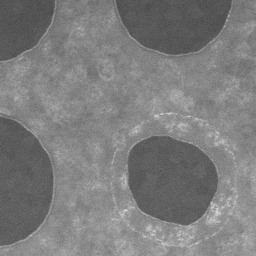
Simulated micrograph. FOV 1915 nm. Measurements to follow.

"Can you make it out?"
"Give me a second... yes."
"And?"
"raised bodies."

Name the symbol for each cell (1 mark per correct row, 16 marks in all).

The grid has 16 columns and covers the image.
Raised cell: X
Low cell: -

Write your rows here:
XXX----XXXXXXX--
XXX-----XXXXXX--
XXX-----XXXXX---
X---------------
----------------
----------------
----------------
X---------------
XX--------X-----
XXX-----XXXXX---
XXX-----XXXXXX--
XXX-----XXXXXX--
XXX-----XXXXX---
XXX------XXXX---
XX--------------
----------------